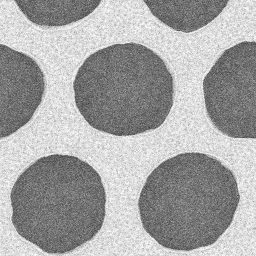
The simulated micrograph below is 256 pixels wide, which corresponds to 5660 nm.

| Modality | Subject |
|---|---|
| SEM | holes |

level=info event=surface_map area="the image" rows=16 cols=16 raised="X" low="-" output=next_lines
X-----XXX-----XX
XX--XXXXXX---XXX
XXXXXXXXXXXXXXXX
--XXXX----XXXX--
---XX------XX---
---XX------XX---
---XX------XX---
--XXX-----XXX---
-XXXXXX-XXXXXX--
XXXXXXXXXXXXXXXX
XX----XXXX----XX
X-----XXX------X
X------XX------X
X------XX------X
X-----XXX-----XX
XX---XXXXX--XXXX